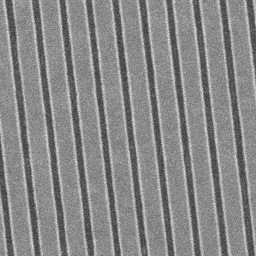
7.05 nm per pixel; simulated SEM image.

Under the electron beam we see parallel lines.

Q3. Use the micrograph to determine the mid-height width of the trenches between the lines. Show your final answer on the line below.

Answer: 0.0595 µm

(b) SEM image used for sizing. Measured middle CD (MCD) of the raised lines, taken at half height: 132 nm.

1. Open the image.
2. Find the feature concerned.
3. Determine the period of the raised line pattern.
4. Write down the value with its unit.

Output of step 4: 188 nanometers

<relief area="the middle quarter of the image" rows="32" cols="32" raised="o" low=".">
..ooooo..ooooo..oooo..ooooo..ooo
o..oooo..ooooo..ooooo..oooo..ooo
...oooo..ooooo..ooooo..oooo...oo
...oooo..ooooo..ooooo..oooo...oo
o..oooo...oooo..ooooo..ooooo..oo
o..ooooo..oooo..ooooo..ooooo..oo
o..ooooo..oooo...oooo..ooooo..oo
o..ooooo..oooo...oooo..ooooo..oo
o..ooooo..ooooo..oooo..ooooo..oo
o..ooooo..ooooo..oooo...oooo..oo
oo..oooo..ooooo..ooooo..oooo..oo
oo..oooo..ooooo..ooooo..oooo..oo
oo..oooo..ooooo..ooooo..oooo...o
oo..oooo...oooo..ooooo..ooooo..o
oo..ooooo..oooo..ooooo..ooooo..o
oo..ooooo..oooo...oooo..ooooo..o
oo..ooooo..oooo...oooo..ooooo..o
oo..ooooo..ooooo..oooo..ooooo..o
oo..ooooo..ooooo..oooo...oooo..o
ooo..oooo..ooooo..ooooo..oooo...
ooo..oooo..ooooo..ooooo..oooo...
ooo..oooo...oooo..ooooo..oooo...
ooo..ooooo..oooo..ooooo..ooooo..
ooo..ooooo..oooo...oooo..ooooo..
ooo..ooooo..oooo...oooo..ooooo..
ooo..ooooo..oooo...oooo..ooooo..
ooo..ooooo..ooooo..oooo..ooooo..
ooo...oooo..ooooo..oooo...oooo..
oooo..oooo..ooooo..oooo...oooo..
oooo..oooo..ooooo..ooooo..oooo..
oooo..oooo..ooooo..ooooo..oooo..
oooo..ooooo..oooo..ooooo..ooooo.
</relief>